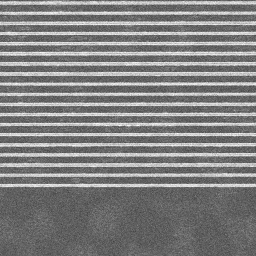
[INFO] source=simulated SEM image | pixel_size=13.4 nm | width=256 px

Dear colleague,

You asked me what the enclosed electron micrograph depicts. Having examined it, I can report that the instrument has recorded parallel lines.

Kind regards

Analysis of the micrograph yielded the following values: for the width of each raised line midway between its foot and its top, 36.8 nm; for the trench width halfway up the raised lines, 7.5 pixels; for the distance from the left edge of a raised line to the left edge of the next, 136 nm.